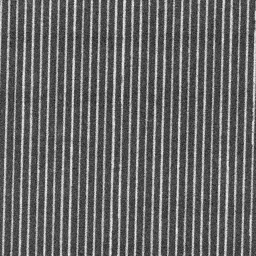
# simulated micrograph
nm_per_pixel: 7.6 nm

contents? parallel lines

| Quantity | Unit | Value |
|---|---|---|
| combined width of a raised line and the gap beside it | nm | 62.6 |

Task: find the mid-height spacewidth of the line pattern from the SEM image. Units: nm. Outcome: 50.3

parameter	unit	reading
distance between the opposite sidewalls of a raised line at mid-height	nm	11.4